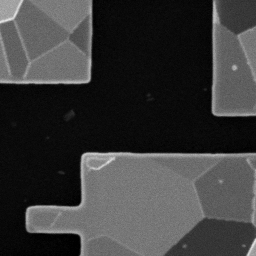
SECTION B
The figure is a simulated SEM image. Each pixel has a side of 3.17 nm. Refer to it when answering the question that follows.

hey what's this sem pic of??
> wiring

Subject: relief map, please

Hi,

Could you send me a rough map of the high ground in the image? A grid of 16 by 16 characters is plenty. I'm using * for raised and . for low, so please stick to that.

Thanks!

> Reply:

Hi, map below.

******.......***
******.......***
******.......***
******.......***
******.......***
.............***
.............***
................
................
................
.....***********
.....***********
.....***********
..**************
..**************
.....***********